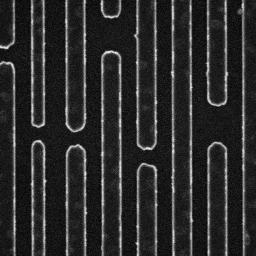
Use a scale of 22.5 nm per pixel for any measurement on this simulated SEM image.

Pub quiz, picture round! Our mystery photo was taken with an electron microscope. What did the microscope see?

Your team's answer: parallel lines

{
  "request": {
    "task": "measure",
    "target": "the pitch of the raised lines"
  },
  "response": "806 nanometres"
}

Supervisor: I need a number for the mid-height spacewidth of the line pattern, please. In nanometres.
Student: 383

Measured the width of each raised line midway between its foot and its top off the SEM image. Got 422 nanometers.